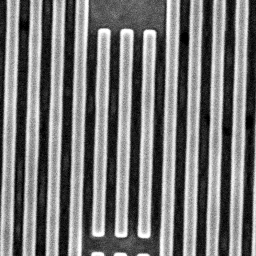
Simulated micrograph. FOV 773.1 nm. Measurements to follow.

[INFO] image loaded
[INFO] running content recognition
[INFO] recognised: groups of lines, slits or small figures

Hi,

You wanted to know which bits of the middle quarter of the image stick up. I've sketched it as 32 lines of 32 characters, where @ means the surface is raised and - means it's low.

---@@----@@---@@@---@@----@@----
---@@----@@---@@@---@@----@@---@
---@@----@@---@@@---@@----@@---@
---@@---@@@---@@@---@@----@@---@
---@@---@@@---@@@---@@----@@---@
---@@---@@@---@@----@@----@@---@
---@@---@@@---@@----@@----@@---@
---@@---@@@---@@----@@---@@@---@
--@@@---@@@---@@----@@---@@@---@
--@@@---@@@---@@----@@---@@@---@
--@@@---@@@---@@----@@---@@@---@
--@@@---@@@---@@----@@---@@@---@
--@@@---@@@---@@----@@---@@@---@
--@@@---@@@---@@----@@---@@@---@
--@@@---@@@---@@----@@---@@@---@
--@@@---@@@---@@----@@---@@@---@
--@@@---@@@---@@----@@---@@@---@
--@@@---@@@---@@----@@---@@@---@
--@@@---@@----@@----@@---@@@---@
--@@@---@@----@@---@@@---@@@---@
--@@@---@@----@@---@@@---@@@---@
--@@@---@@----@@---@@@---@@@---@
--@@@---@@---@@@---@@@---@@@---@
--@@@---@@---@@@---@@@---@@@---@
--@@@---@@---@@@---@@@---@@@---@
--@@@---@@---@@@---@@@---@@@---@
--@@@---@@---@@@---@@@---@@@---@
--@@@---@@---@@@---@@@---@@@---@
--@@@---@@---@@@---@@@---@@@---@
--@@@---@@---@@@---@@@---@@----@
--@@@---@@---@@@---@@@---@@----@
--@@----@@---@@@---@@@---@@----@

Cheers